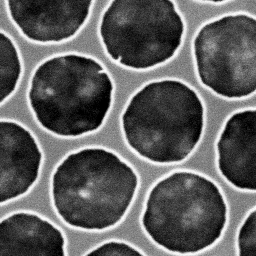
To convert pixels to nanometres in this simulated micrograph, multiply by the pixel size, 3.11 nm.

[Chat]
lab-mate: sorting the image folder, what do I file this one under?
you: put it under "holes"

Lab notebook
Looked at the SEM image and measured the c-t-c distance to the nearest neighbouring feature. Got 94.2 pixels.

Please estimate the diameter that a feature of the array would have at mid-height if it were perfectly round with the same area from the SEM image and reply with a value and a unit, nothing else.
82.9 px